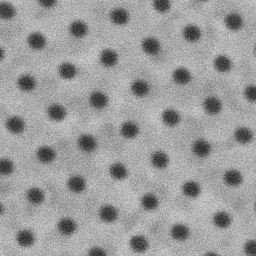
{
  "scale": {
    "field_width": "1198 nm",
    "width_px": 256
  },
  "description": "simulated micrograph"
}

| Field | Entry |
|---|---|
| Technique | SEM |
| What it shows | a regular array of holes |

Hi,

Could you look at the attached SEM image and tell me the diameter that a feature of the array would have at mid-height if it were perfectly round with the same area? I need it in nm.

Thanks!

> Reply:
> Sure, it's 89.1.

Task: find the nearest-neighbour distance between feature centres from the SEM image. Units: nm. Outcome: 200